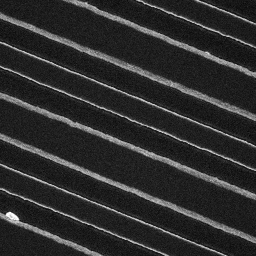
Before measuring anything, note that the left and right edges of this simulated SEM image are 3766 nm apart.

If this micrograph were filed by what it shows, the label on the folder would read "lines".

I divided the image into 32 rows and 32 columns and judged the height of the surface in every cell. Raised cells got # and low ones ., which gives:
###########.......########......
#############........#######....
.##############........########.
....##############........######
......##############........####
#........##############........#
###........##############.......
######........##############....
########........##############..
...########........#############
.....########........###########
........#######........#########
##........########........######
####.........#######........####
#######........########........#
#########.........#######.......
############........########....
.##############........#######..
...##############........#######
......#############.........####
........##############........##
##.........#############........
#####........##############.....
#######........##############...
..########........##############
.....#######........############
.......########........#########
##........#######........#######
####........########........####
#######........#######........##
#########........########.......
###########.........#######.....